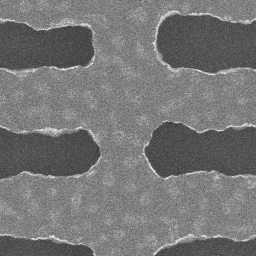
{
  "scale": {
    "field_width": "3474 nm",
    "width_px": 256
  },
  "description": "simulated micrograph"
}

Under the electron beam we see holes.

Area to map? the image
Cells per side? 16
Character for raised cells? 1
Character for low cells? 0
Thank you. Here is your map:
1111111111111111
0111111111000000
0000001111000000
0000001111000000
1111111111111011
1111111111111111
1111111111111111
1111111111111111
0000001110000000
0000001110000000
0000001111000000
1111111111111111
1111111111111111
1111111111111111
1111111111111111
0000011111000000